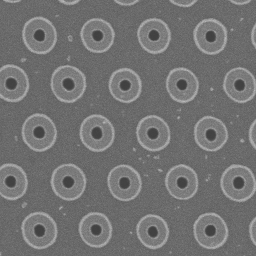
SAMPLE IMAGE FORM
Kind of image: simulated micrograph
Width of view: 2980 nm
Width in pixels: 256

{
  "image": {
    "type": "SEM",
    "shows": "a regular array of ring-shaped raised bodies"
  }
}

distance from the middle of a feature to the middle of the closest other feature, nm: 649